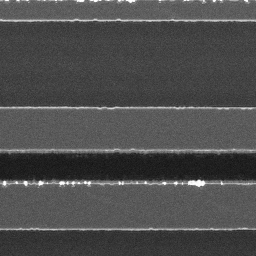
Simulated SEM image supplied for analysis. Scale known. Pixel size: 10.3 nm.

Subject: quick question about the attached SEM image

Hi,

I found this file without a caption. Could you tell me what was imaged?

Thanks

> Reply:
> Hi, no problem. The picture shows lines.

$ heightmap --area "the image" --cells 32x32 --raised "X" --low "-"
XXXXXXXXXXXXXXXXXXXXXXXXXXXXXXXX
XXXXXXXXXXXXXXXXXXXXXXXXXXXXXXXX
XXXXXXXXXXXXXXXXXXXXXXXXXXXXXXXX
--------------------------------
--------------------------------
--------------------------------
--------------------------------
--------------------------------
--------------------------------
--------------------------------
--------------------------------
--------------------------------
--------------------------------
--------------------------------
XXXXXXXXXXXXXXXXXXXXXXXXXXXXXXXX
XXXXXXXXXXXXXXXXXXXXXXXXXXXXXXXX
XXXXXXXXXXXXXXXXXXXXXXXXXXXXXXXX
XXXXXXXXXXXXXXXXXXXXXXXXXXXXXXXX
XXXXXXXXXXXXXXXXXXXXXXXXXXXXXXXX
--------------------------------
--------------------------------
--------------------------------
--------------------------------
XXXXXXXXXXXXXXXXXXXXXXXXXXXXXXXX
XXXXXXXXXXXXXXXXXXXXXXXXXXXXXXXX
XXXXXXXXXXXXXXXXXXXXXXXXXXXXXXXX
XXXXXXXXXXXXXXXXXXXXXXXXXXXXXXXX
XXXXXXXXXXXXXXXXXXXXXXXXXXXXXXXX
XXXXXXXXXXXXXXXXXXXXXXXXXXXXXXXX
--------------------------------
--------------------------------
--------------------------------